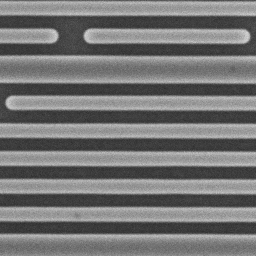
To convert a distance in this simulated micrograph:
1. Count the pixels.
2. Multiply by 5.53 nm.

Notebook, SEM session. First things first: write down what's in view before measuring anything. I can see groups of lines, slits or small figures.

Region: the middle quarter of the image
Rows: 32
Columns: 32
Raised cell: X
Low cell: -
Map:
XXXXXXXXXXXXXXXXXXXXXXXXXXXXXXXX
XXXXXXXXXXXXXXXXXXXXXXXXXXXXXXXX
XXXXXXXXXXXXXXXXXXXXXXXXXXXXXXXX
XXXXXXXXXXXXXXXXXXXXXXXXXXXXXXXX
XXXXXXXXXXXXXXXXXXXXXXXXXXXXXXXX
--------------------------------
--------------------------------
--------------------------------
XXXXXXXXXXXXXXXXXXXXXXXXXXXXXXXX
XXXXXXXXXXXXXXXXXXXXXXXXXXXXXXXX
XXXXXXXXXXXXXXXXXXXXXXXXXXXXXXXX
--------------------------------
--------------------------------
--------------------------------
--------------------------------
XXXXXXXXXXXXXXXXXXXXXXXXXXXXXXXX
XXXXXXXXXXXXXXXXXXXXXXXXXXXXXXXX
XXXXXXXXXXXXXXXXXXXXXXXXXXXXXXXX
--------------------------------
--------------------------------
--------------------------------
--------------------------------
XXXXXXXXXXXXXXXXXXXXXXXXXXXXXXXX
XXXXXXXXXXXXXXXXXXXXXXXXXXXXXXXX
XXXXXXXXXXXXXXXXXXXXXXXXXXXXXXXX
--------------------------------
--------------------------------
--------------------------------
--------------------------------
XXXXXXXXXXXXXXXXXXXXXXXXXXXXXXXX
XXXXXXXXXXXXXXXXXXXXXXXXXXXXXXXX
XXXXXXXXXXXXXXXXXXXXXXXXXXXXXXXX